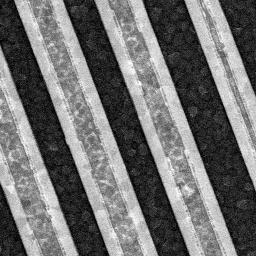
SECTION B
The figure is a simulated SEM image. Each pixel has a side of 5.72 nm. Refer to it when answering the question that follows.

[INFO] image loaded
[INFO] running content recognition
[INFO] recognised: one or a few lines or trenches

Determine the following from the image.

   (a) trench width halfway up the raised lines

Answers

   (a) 42.6 pixels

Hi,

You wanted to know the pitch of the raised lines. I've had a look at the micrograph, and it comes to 433 nanometres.